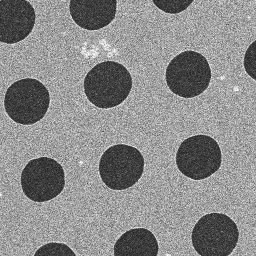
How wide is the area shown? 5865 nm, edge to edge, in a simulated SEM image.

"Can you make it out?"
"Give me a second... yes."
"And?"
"holes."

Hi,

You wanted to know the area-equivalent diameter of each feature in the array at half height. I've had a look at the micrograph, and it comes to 1.06 micrometres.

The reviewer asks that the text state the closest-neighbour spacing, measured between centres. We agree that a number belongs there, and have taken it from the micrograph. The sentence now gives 1830 nanometers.